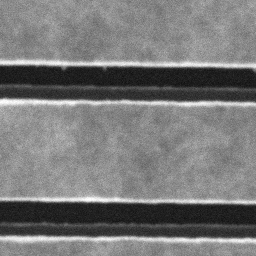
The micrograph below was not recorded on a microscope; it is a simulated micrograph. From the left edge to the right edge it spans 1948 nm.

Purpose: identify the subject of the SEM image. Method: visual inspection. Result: lines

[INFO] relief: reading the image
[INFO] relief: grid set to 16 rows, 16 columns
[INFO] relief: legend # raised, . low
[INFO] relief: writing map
################
################
################
################
................
................
################
################
################
################
################
################
################
................
................
################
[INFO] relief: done